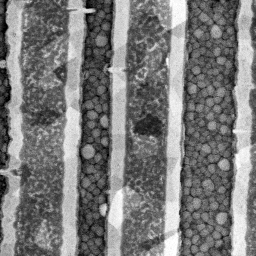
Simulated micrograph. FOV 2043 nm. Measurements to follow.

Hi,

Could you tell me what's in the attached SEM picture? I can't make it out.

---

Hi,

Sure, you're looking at one or a few lines or trenches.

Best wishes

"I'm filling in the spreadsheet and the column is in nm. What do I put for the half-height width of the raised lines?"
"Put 458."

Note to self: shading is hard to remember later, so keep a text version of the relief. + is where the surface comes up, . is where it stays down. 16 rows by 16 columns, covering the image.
.++++...+++....+
.++++...+++....+
.++++..++++....+
.++++..++++....+
.++++..++++....+
.++++..++++....+
.++++..++++....+
.++++..++++....+
.+++...++++....+
.+++...++++....+
.+++...++++....+
.+++...++++....+
.+++...++++....+
++++...++++....+
.+++...++++....+
++++...++++....+